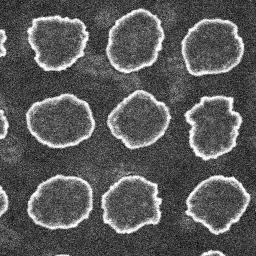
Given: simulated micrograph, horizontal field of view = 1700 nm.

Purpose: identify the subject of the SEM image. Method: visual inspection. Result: a regular array of raised bodies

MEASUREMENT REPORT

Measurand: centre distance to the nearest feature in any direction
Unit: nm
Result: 506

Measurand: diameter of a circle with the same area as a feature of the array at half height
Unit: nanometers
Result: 370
